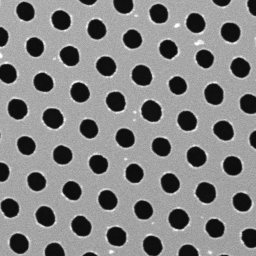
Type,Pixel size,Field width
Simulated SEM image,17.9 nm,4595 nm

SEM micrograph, a regular array of holes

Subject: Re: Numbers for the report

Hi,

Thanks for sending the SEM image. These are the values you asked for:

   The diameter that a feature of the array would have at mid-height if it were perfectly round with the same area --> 358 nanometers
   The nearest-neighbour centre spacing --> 658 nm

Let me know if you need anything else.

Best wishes